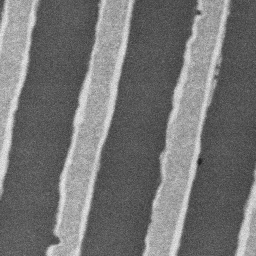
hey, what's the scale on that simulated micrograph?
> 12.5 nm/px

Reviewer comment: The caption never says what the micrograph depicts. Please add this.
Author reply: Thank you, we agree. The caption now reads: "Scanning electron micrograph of one or a few lines or trenches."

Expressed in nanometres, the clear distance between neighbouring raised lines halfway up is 825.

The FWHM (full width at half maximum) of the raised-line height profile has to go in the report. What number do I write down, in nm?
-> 341